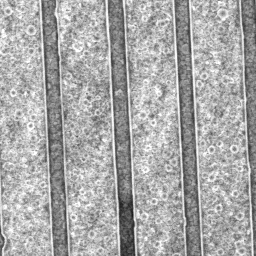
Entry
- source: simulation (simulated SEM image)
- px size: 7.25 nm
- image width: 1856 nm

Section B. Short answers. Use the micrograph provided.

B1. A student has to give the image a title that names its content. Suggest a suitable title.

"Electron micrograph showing one or a few lines or trenches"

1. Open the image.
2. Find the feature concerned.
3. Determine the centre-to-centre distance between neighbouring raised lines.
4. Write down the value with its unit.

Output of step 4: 482 nm